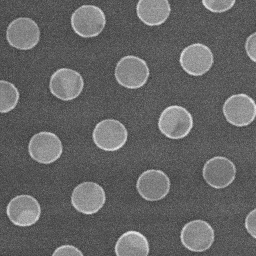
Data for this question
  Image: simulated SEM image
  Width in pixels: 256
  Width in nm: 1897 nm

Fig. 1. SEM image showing a regular array of raised bodies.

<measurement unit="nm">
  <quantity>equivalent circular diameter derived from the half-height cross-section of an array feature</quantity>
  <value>236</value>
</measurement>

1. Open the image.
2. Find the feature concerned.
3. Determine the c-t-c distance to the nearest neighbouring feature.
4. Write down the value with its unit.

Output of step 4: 490 nanometres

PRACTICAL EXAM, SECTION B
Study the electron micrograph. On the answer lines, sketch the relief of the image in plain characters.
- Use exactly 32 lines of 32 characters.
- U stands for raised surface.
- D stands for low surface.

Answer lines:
DDDDDDDDDDDDDDDDDUUUUDDDDDUUUDDD
DDDDDDDDDUUUUDDDDUUUUDDDDDDDDDDD
DDUUDDDDDUUUUDDDDDUUUDDDDDDDDDDD
DUUUUDDDDUUUUDDDDDDDDDDDDDDDDDDD
DUUUUDDDDDUUDDDDDDDDDDDDDDDDDDDU
DUUUDDDDDDDDDDDDDDDDDDDDDDDDDDDU
DDDDDDDDDDDDDDDDDDDDDDDUUUDDDDDU
DDDDDDDDDDDDDDDUUUDDDDDUUUUDDDDD
DDDDDDDDDDDDDDDUUUDDDDDUUUDDDDDD
DDDDDDDUUUDDDDUUUUDDDDDDDDDDDDDD
UDDDDDUUUUDDDDDUUUDDDDDDDDDDDDDD
UUDDDDDUUUDDDDDDDDDDDDDDDDDDDDDD
UUDDDDDDDDDDDDDDDDDDDDDDDDDDUUUD
UUDDDDDDDDDDDDDDDDDDDUUDDDDDUUUU
DDDDDDDDDDDDDDDDDDDDUUUUDDDDUUUU
DDDDDDDDDDDDUUUDDDDDUUUUDDDDDUUD
DDDDDDDDDDDDUUUUDDDDUUUDDDDDDDDD
DDDDUUUDDDDDUUUUDDDDDDDDDDDDDDDD
DDDDUUUUDDDDDUUDDDDDDDDDDDDDDDDD
DDDDUUUDDDDDDDDDDDDDDDDDDDDDDDDD
DDDDDDDDDDDDDDDDDDDDDDDDDDUUUDDD
DDDDDDDDDDDDDDDDDDUUDDDDDUUUUDDD
DDDDDDDDDDDDDDDDDUUUUDDDDDUUUDDD
DDDDDDDDDDUUUDDDDUUUUDDDDDDDDDDD
DDDDDDDDDUUUUDDDDDUUDDDDDDDDDDDD
DUUUUDDDDUUUUDDDDDDDDDDDDDDDDDDD
DUUUUDDDDDUUDDDDDDDDDDDDDDDDDDDU
DUUUUDDDDDDDDDDDDDDDDDDDDDDDDDDU
DDDDDDDDDDDDDDDDDDDDDDDUUUDDDDDU
DDDDDDDDDDDDDDDUUUDDDDDUUUUDDDDD
DDDDDDDDDDDDDDDUUUDDDDDUUUDDDDDD
DDDDDDDUUUDDDDUUUUDDDDDDDDDDDDDD